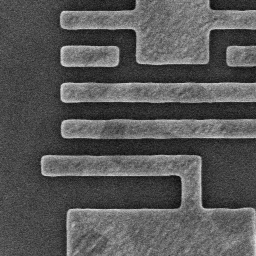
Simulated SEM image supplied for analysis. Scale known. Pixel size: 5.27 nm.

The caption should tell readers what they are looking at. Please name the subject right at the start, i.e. wiring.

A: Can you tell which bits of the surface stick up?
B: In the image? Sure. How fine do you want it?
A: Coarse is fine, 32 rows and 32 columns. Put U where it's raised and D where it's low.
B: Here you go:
DDDDDDDDDDDDDDDDDUUUUUUUUUDDDDDD
DDDDDDDDUUUUUUUUUUUUUUUUUUUUUUUU
DDDDDDDDUUUUUUUUUUUUUUUUUUUUUUUU
DDDDDDDDUUUUUUUUUUUUUUUUUUUUUUUU
DDDDDDDDDDDDDDDDDUUUUUUUUUDDDDDD
DDDDDDDDDDDDDDDDDUUUUUUUUUDDDDDD
DDDDDDDDUUUUUUUDDUUUUUUUUUDDUUUU
DDDDDDDDUUUUUUUDDUUUUUUUUUDDUUUU
DDDDDDDDDDDDDDDDDDDDDDDDDDDDDDDD
DDDDDDDDDDDDDDDDDDDDDDDDDDDDDDDD
DDDDDDDDUUUUUUUUUUUUUUUUUUUUUUUU
DDDDDDDDUUUUUUUUUUUUUUUUUUUUUUUU
DDDDDDDDUUUUUUUUUUUUUUUUUUUUUUUU
DDDDDDDDDDDDDDDDDDDDDDDDDDDDDDDD
DDDDDDDDDDDDDDDDDDDDDDDDDDDDDDDD
DDDDDDDDUUUUUUUUUUUUUUUUUUUUUUUU
DDDDDDDDUUUUUUUUUUUUUUUUUUUUUUUU
DDDDDDDDDDDDDDDDDDDDDDDDDDDDDDDD
DDDDDDDDDDDDDDDDDDDDDDDDDDDDDDDD
DDDDDDDDDDDDDDDDDDDUUDUUDDDDDDDD
DDDDDUUUUUUUUUUUUUUUUUUUUDDDDDDD
DDDDDUUUUUUUUUUUUUUUUUUUUDDDDDDD
DDDDDDDDDDDDDDDDDDDDDDDUUDDDDDDD
DDDDDDDDDDDDDDDDDDDDDDDUUDDDDDDD
DDDDDDDDDDDDDDDDDDDDDDDUUDDDDDDD
DDDDDDDDDDDDDDDDDDDDDDDUUDDDDDDD
DDDDDDDDDUUUUUUUUUUUUUUUUUUUUUUU
DDDDDDDDUUUUUUUUUUUUUUUUUUUUUUUU
DDDDDDDDUUUUUUUUUUUUUUUUUUUUUUUU
DDDDDDDDUUUUUUUUUUUUUUUUUUUUUUUU
DDDDDDDDUUUUUUUUUUUUUUUUUUUUUUUU
DDDDDDDDUUUUUUUUUUUUUUUUUUUUUUUU